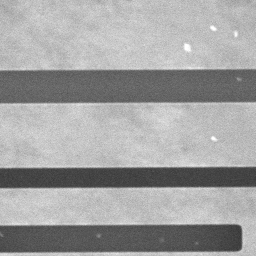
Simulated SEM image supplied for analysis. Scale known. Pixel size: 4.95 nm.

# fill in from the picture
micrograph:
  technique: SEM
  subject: groups of lines, slits or small figures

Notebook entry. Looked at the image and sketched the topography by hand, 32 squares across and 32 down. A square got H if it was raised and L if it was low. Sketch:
HHHHHHHHHHHHHHHHHHHHHHHHHHHHHHHH
HHHHHHHHHHHHHHHHHHHHHHHHHHHHHHHH
HHHHHHHHHHHHHHHHHHHHHHHHHHHHHHHH
HHHHHHHHHHHHHHHHHHHHHHHHHHHHHHHH
HHHHHHHHHHHHHHHHHHHHHHHHHHHHHHHH
HHHHHHHHHHHHHHHHHHHHHHHHHHHHHHHH
HHHHHHHHHHHHHHHHHHHHHHHHHHHHHHHH
HHHHHHHHHHHHHHHHHHHHHHHHHHHHHHHH
HHHHHHHHHHHHHHHHHHHHHHHHHHHHHHHH
LLLLLLLLLLLLLLLLLLLLLLLLLLLLLLLL
LLLLLLLLLLLLLLLLLLLLLLLLLLLLLLLL
LLLLLLLLLLLLLLLLLLLLLLLLLLLLLLLL
LLLLLLLLLLLLLLLLLLLLLLLLLLLLLLLL
HHHHHHHHHHHHHHHHHHHHHHHHHHHHHHHH
HHHHHHHHHHHHHHHHHHHHHHHHHHHHHHHH
HHHHHHHHHHHHHHHHHHHHHHHHHHHHHHHH
HHHHHHHHHHHHHHHHHHHHHHHHHHHHHHHH
HHHHHHHHHHHHHHHHHHHHHHHHHHHHHHHH
HHHHHHHHHHHHHHHHHHHHHHHHHHHHHHHH
HHHHHHHHHHHHHHHHHHHHHHHHHHHHHHHH
HHHHHHHHHHHHHHHHHHHHHHHHHHHHHHHH
LLLLLLLLLLLLLLLLLLLLLLLLLLLLLLLL
LLLLLLLLLLLLLLLLLLLLLLLLLLLLLLLL
LLLLLLLLLLLLLLLLLHHHHHHHHHHHHHHH
HHHHHHHHHHHHHHHHHHHHHHHHHHHHHHHH
HHHHHHHHHHHHHHHHHHHHHHHHHHHHHHHH
HHHHHHHHHHHHHHHHHHHHHHHHHHHHHHHH
HHHHHHHHHHHHHHHHHHHHHHHHHHHHHHHH
LLLLLLLLLLLLLLLLLLLLLLLLLLLLLLHH
LLLLLLLLLLLLLLLLLLLLLLLLLLLLLLHH
LLLLLLLLLLLLLLLLLLLLLLLLLLLLLLHH
LLLLLLLLLLLLLLLLLLLLLLLLLLLLLHHH